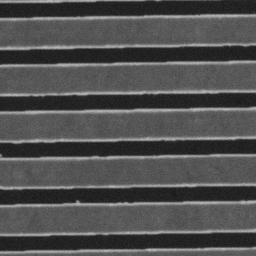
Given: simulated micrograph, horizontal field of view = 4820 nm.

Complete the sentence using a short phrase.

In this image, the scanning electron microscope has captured lines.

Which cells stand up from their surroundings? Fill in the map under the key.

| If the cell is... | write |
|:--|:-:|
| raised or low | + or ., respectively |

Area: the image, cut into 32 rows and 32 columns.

................................
................................
++++++++++++++++++++++++++++++++
++++++++++++++++++++++++++++++++
++++++++++++++++++++++++++++++++
++++++++++++++++++++++++++++++++
................................
................................
++++++++++++++++++++++++++++++++
++++++++++++++++++++++++++++++++
++++++++++++++++++++++++++++++++
++++++++++++++++++++++++++++++++
................................
................................
++++++++++++++++++++++++++++++++
++++++++++++++++++++++++++++++++
++++++++++++++++++++++++++++++++
++++++++++++++++++++............
................................
....................++++++++++++
++++++++++++++++++++++++++++++++
++++++++++++++++++++++++++++++++
++++++++++++++++++++++++++++++++
+++++++++.......................
................................
........++++++++++++++++++++++++
++++++++++++++++++++++++++++++++
++++++++++++++++++++++++++++++++
++++++++++++++++++++++++++++++++
................................
................................
++++++++++++++++++++++++++++++++